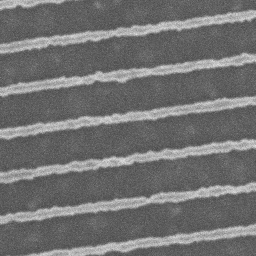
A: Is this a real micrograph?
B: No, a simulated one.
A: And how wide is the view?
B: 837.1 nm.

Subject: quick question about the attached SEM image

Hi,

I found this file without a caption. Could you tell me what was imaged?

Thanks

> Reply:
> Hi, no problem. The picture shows parallel lines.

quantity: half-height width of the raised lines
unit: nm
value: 23.1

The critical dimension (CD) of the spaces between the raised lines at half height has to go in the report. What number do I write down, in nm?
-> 116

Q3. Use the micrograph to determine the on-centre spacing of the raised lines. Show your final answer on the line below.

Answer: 0.139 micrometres